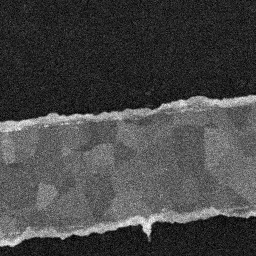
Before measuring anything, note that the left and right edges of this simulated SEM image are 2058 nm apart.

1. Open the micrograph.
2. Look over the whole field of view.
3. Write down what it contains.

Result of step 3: one or a few lines or trenches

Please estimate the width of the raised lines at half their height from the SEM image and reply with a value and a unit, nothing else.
113 px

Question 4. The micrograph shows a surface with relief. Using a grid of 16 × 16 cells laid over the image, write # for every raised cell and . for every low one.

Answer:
................
................
................
................
................
................
...........#####
...#############
################
################
################
################
################
############..#.
#####...........
................